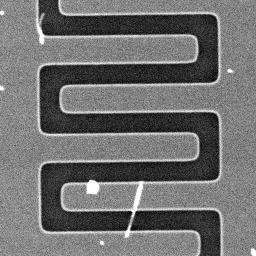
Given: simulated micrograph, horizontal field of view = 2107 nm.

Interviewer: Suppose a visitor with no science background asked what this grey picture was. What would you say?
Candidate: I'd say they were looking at groups of lines, slits or small figures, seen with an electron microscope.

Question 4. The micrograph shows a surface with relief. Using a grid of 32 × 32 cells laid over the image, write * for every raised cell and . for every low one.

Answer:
*****..*************************
*****...************************
*****......................*****
*****......................*****
******......************...*****
*************************..*****
*************************..*****
************************...*****
*****......................*****
*****......................*****
*****..................*********
*****...************************
*****..*************************
*****...************************
*****......................*****
*****.......................****
*****.......................****
*************************...****
*************************...****
*************************...****
******......................****
*****.......................****
*****......................*****
*****...************************
*****...************************
*****...************************
*****......................*****
*****.......................****
*****.......................****
*************************...****
*************************...****
*************************...****